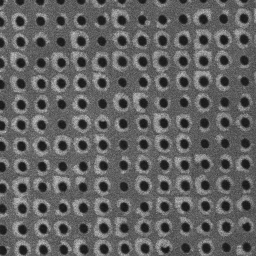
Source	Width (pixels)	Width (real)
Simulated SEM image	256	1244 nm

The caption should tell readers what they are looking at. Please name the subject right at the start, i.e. a regular array of holes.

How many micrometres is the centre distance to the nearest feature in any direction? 0.098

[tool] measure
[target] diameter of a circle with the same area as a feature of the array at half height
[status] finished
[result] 43.9 nm